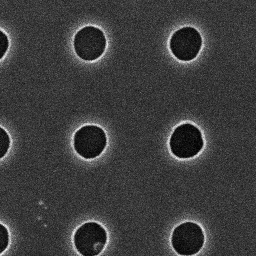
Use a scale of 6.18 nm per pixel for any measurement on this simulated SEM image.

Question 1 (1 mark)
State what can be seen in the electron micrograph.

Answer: holes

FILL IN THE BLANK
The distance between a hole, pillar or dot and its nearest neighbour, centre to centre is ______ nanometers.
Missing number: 594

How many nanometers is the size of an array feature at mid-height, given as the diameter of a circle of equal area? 207